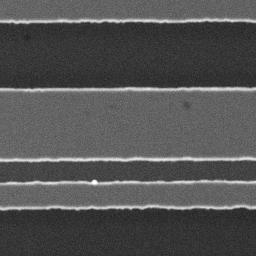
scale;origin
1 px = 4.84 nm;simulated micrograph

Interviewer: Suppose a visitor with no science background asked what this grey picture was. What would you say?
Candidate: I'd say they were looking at lines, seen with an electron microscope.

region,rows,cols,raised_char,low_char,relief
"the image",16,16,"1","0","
1111111111111111
0000000000000000
0000000000000000
0000000000000000
0000000000000000
0000000000000000
1111111111111111
1111111111111111
1111111111111111
1111111111111111
1111111111111111
1111111111111111
1111111111111111
0000000000000000
0000000000000000
0000000000000000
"